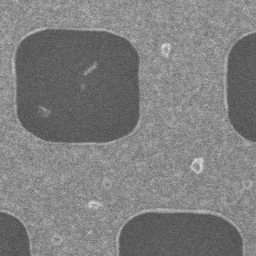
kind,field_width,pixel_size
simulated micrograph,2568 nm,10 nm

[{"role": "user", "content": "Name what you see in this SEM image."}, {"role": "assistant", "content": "holes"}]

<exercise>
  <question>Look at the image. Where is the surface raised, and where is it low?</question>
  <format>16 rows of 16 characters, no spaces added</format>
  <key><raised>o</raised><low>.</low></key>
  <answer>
oooooooooooooooo
oooooooooooooooo
o.......ooooooo.
o........ooooo..
o........ooooo..
o........ooooo..
o........ooooo..
o........ooooo..
oo......ooooooo.
oooooooooooooooo
oooooooooooooooo
oooooooooooooooo
oooooooooooooooo
.ooooooo......oo
..oooooo.......o
..ooooo........o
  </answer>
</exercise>